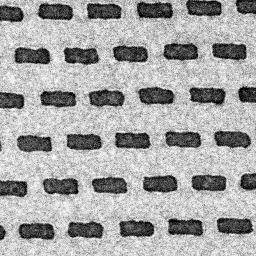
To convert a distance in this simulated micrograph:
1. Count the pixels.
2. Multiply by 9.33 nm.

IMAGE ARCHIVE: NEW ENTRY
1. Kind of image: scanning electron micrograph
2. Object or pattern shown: a regular array of holes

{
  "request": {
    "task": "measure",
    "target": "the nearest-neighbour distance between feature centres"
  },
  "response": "456 nm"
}